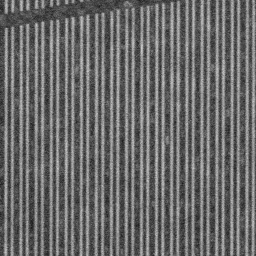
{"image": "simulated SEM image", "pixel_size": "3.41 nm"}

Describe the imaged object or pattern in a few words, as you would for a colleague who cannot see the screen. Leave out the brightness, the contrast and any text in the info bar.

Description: parallel lines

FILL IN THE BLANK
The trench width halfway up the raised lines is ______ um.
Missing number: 0.0149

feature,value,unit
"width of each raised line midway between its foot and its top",7.7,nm